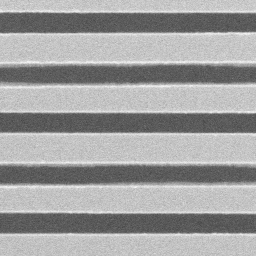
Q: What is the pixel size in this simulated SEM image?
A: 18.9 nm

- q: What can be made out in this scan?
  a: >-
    lines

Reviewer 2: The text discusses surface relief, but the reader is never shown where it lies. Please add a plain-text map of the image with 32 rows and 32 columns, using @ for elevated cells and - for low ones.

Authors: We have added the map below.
@@@@@@@@@@@@@@@@@@@@@@@@@@@@@@@@
--------------------------------
--------------------------------
--------------------------------
@@@@@@@@@@@@@@@@@@@@@@@@@@@@@@@@
@@@@@@@@@@@@@@@@@@@@@@@@@@@@@@@@
@@@@@@@@@@@@@@@@@@@@@@@@@@@@@@@@
@@@@@@@@@@@@@@@@@@@@@@@@@@@@@@@@
--------------------------------
--------------------------------
--------------------------------
@@@@@@@@@@@@@@@@@@@@@@@@@@@@@@@@
@@@@@@@@@@@@@@@@@@@@@@@@@@@@@@@@
@@@@@@@@@@@@@@@@@@@@@@@@@@@@@@@@
--------------------------------
--------------------------------
--------------------------------
@@@@@@@@@@@@@@@@@@@@@@@@@@@@@@@@
@@@@@@@@@@@@@@@@@@@@@@@@@@@@@@@@
@@@@@@@@@@@@@@@@@@@@@@@@@@@@@@@@
--------------------------------
--------------------------------
--------------------------------
@@@@@@@@@@@@@@@@@@@@@@@@@@@@@@@@
@@@@@@@@@@@@@@@@@@@@@@@@@@@@@@@@
@@@@@@@@@@@@@@@@@@@@@@@@@@@@@@@@
-----@--@@@@@@@@@@@@@@@@@@@@@@@@
--------------------------------
--------------------------------
@@@@@@@@@@@@@@@@@@@@@@@@@@@@@@@@
@@@@@@@@@@@@@@@@@@@@@@@@@@@@@@@@
@@@@@@@@@@@@@@@@@@@@@@@@@@@@@@@@